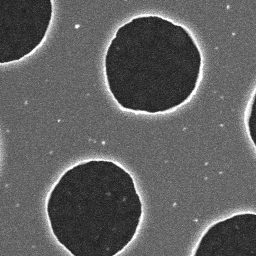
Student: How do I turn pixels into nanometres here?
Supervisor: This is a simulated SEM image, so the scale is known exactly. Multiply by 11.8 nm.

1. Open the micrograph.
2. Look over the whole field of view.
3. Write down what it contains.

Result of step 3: holes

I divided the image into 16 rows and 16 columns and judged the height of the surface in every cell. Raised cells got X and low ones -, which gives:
---XXXXXXXXXXXXX
---XXXXX---XXXXX
---XXXX-----XXXX
--XXXXX-----XXXX
XXXXXXX-----XXXX
XXXXXXX-----XXXX
XXXXXXXX---XXXXX
XXXXXXXXXXXXXXXX
XXXXXXXXXXXXXXXX
XXXXXXXXXXXXXXXX
XXXXX---XXXXXXXX
XXXX----XXXXXXXX
XXX------XXXXXXX
XXX------XXXXXX-
XXX-----XXXXX---
XXXX----XXXX----